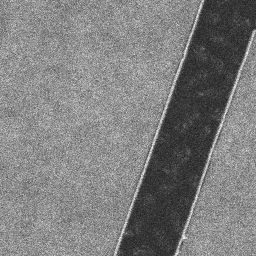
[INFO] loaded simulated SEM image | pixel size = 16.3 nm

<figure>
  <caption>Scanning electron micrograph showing one or a few lines or trenches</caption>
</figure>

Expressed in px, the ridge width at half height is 59.2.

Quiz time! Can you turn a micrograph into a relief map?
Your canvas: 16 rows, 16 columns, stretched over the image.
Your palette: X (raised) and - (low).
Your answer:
------------XXXX
------------XXXX
------------XXXX
-----------XXXX-
-----------XXXX-
-----------XXXX-
----------XXXX--
----------XXXX--
----------XXXX--
---------XXXX---
---------XXXX---
---------XXXX---
--------XXXX----
--------XXXX----
--------XXXX----
-------XXXX-----